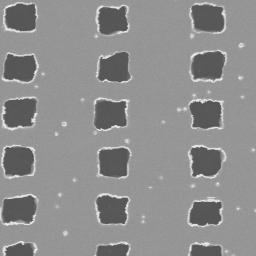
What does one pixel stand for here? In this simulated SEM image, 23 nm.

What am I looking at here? a regular array of holes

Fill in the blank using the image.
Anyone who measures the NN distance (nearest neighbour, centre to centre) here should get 1090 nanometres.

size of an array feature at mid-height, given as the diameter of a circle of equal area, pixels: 30.9